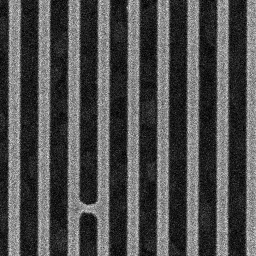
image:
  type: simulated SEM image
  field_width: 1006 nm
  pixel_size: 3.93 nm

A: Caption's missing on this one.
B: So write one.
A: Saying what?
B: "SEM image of parallel lines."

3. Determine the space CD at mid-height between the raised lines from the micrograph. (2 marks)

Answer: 72.8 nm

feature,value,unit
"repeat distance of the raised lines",117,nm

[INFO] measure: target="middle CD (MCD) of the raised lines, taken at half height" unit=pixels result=10.9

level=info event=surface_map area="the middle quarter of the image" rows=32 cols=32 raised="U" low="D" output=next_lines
DUUUDDDDDUUDDDDDUUUDDDDUUUDDDDDU
DUUUDDDDDUUDDDDDUUUDDDDUUUDDDDDU
DUUUDDDDDUUDDDDDUUUDDDDUUUDDDDDU
DUUUDDDDDUUDDDDDUUUDDDDDUUDDDDDU
DUUUDDDDDUUDDDDDUUUDDDDDUUDDDDDU
DUUUDDDDDUUDDDDDUUUDDDDDUUDDDDDU
DUUUDDDDDUUDDDDDUUUDDDDUUUDDDDDU
DUUUDDDDDUUDDDDDUUUDDDDUUUDDDDDU
DUUUDDDDDUUDDDDDUUUDDDDDUUDDDDDU
DUUUDDDDDUUDDDDDUUUDDDDDUUDDDDDU
DUUUDDDDDUUDDDDDUUUDDDDDUUDDDDDU
DUUUDDDDDUUDDDDDUUUDDDDDUUDDDDDU
DUUUDDDDDUUDDDDDUUUDDDDDUUDDDDDU
DUUUDDDDDUUDDDDDUUUDDDDUUUDDDDDU
DUUUDDDDDUUDDDDDUUUDDDDUUUDDDDDU
DUUUDDDDDUUDDDDDUUUDDDDUUUDDDDDU
DUUUDDDDDUUDDDDDUUUDDDDDUUDDDDDU
DUUUDDDDDUUDDDDDUUUDDDDUUUDDDDDU
DUUUDDDDDUUDDDDDUUUDDDDUUUDDDDDU
DUUUDDDDUUUDDDDDUUUDDDDDUUDDDDDU
DUUUDDDDDUUDDDDDUUUDDDDDUUDDDDDU
DUUUDDDDDUUDDDDDUUUDDDDDUUDDDDDU
DUUUDDDDUUUDDDDDUUUDDDDUUUDDDDDU
DUUUDDDDDUUDDDDDUUUDDDDUUUDDDDDU
DUUUDDDDDUUDDDDDUUUDDDDUUUDDDDDU
DUUUDDDDDUUDDDDDUUUDDDDUUUDDDDDU
DUUUDDDDDUUDDDDDUUUDDDDUUUDDDDDU
DUUUDDDDDUUDDDDDUUUDDDDUUUDDDDDU
DUUUDDDDDUUDDDDDUUDDDDDUUUDDDDDU
DUUUDDDDDUUDDDDDUUDDDDDUUUDDDDDU
DUUUDDDDDUUDDDDDUUDDDDDUUUDDDDDU
DUUUDDDDDUUDDDDDUUDDDDDDUUDDDDDU